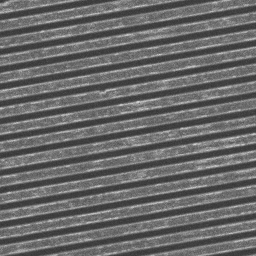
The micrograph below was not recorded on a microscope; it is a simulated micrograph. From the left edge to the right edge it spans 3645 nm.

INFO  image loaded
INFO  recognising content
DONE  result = parallel lines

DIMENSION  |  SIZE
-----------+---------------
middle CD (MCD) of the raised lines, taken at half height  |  9.86 pixels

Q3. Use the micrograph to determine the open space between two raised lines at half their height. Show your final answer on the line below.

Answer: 0.0983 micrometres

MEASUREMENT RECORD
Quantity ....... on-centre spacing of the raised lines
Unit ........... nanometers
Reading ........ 243